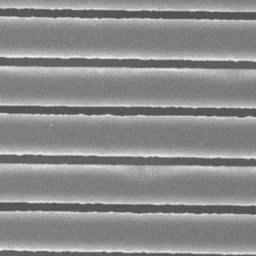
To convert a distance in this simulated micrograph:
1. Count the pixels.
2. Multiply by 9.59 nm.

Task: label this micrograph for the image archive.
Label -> lines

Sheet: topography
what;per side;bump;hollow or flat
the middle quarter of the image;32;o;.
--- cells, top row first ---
................................
oooooooooooooooooooooooooooooooo
oooooooooooooooooooooooooooooooo
oooooooooooooooooooooooooooooooo
oooooooooooooooooooooooooooooooo
oooooooooooooooooooooooooooooooo
oooooooooooooooooooooooooooooooo
oooooooooooooooooooooooooooooooo
oooooooooooooooooooooooooooooooo
oooooooooooooooooooooooooooooooo
oooooooooooooooooooooooooooooooo
................................
................................
oooooooooooooooooooooooooooooooo
oooooooooooooooooooooooooooooooo
oooooooooooooooooooooooooooooooo
oooooooooooooooooooooooooooooooo
oooooooooooooooooooooooooooooooo
oooooooooooooooooooooooooooooooo
oooooooooooooooooooooooooooooooo
oooooooooooooooooooooooooooooooo
oooooooooooooooooooooooooooooooo
oooooooooooooooooooooooooooooooo
................................
................................
................................
oooooooooooooooooooooooooooooooo
oooooooooooooooooooooooooooooooo
oooooooooooooooooooooooooooooooo
oooooooooooooooooooooooooooooooo
oooooooooooooooooooooooooooooooo
oooooooooooooooooooooooooooooooo